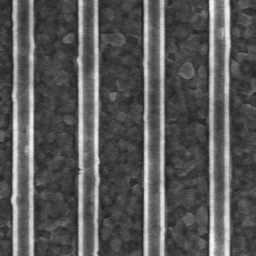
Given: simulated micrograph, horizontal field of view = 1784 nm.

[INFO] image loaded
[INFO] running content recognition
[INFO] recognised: one or a few lines or trenches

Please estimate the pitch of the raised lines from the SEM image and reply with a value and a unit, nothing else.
455 nm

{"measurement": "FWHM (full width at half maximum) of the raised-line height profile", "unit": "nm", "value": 118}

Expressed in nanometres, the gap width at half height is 333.